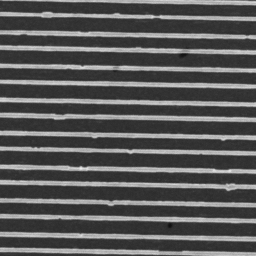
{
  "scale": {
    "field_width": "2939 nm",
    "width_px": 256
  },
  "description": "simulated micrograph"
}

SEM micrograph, parallel lines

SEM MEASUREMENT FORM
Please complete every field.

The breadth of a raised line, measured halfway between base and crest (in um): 0.0431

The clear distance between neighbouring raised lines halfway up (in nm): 152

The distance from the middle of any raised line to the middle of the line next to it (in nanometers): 193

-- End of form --